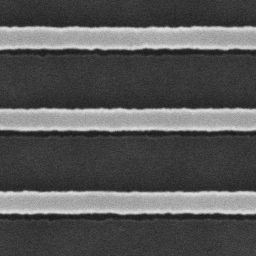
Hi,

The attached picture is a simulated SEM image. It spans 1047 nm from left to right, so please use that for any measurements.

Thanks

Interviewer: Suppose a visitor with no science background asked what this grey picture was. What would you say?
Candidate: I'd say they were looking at lines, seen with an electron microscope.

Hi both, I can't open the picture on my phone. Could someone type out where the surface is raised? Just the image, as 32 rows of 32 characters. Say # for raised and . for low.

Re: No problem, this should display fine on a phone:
................................
................................
................................
#################.##############
################################
################################
................................
................................
................................
................................
................................
................................
................................
................................
################################
################################
................................
................................
................................
................................
................................
................................
................................
................................
################################
################################
################################
................................
................................
................................
................................
................................